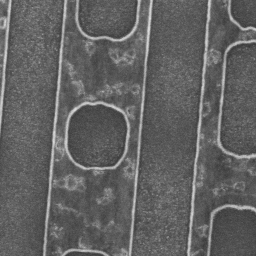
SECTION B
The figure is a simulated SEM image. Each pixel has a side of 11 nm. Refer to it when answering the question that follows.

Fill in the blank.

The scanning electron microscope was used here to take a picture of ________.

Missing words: one or a few lines or trenches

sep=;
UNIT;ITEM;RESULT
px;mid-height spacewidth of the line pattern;57.5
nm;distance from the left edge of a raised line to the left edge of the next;800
